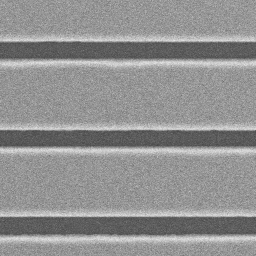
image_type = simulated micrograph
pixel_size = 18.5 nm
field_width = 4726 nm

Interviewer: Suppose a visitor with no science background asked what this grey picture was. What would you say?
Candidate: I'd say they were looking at lines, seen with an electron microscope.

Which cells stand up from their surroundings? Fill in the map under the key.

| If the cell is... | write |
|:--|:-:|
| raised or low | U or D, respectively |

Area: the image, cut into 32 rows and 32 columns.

UUUUUUUUUUUUUUUUUUUUUUUUUUUUUUUU
UUUUUUUUUUUUUUUUUUUUUUUUUUUUUUUU
UUUUUUUUUUUUUUUUUUUUUUUUUUUUUUUU
UUUUUUUUUUUUUUUUUUUUUUUUUUUUUUUU
UUUUUUUUUUUUUUUUUUUUUUUUUUUUUUUU
DDDDDDDDDDDDDDDDDDDDDDDDDDDDDDDD
DDDDDDDDDDDDDDDDDDDDDDDDDDDDDDDD
DDDDDDDDDDDDDDDDDDDDDDDDDDDDDDDD
UUUUUUUUUUUUUUUUUUUUUUUUUUUUUUUU
UUUUUUUUUUUUUUUUUUUUUUUUUUUUUUUU
UUUUUUUUUUUUUUUUUUUUUUUUUUUUUUUU
UUUUUUUUUUUUUUUUUUUUUUUUUUUUUUUU
UUUUUUUUUUUUUUUUUUUUUUUUUUUUUUUU
UUUUUUUUUUUUUUUUUUUUUUUUUUUUUUUU
UUUUUUUUUUUUUUUUUUUUUUUUUUUUUUUU
UUUUUUUUUUUUUUUUUUUUUUUUUUUUUUUU
DDDDDDDDDDDDDDDDDDDDDDDDDDDDDDDD
DDDDDDDDDDDDDDDDDDDDDDDDDDDDDDDD
UUUUUUUUUUUUUUUUUUUUUUUUUUUUUUUU
UUUUUUUUUUUUUUUUUUUUUUUUUUUUUUUU
UUUUUUUUUUUUUUUUUUUUUUUUUUUUUUUU
UUUUUUUUUUUUUUUUUUUUUUUUUUUUUUUU
UUUUUUUUUUUUUUUUUUUUUUUUUUUUUUUU
UUUUUUUUUUUUUUUUUUUUUUUUUUUUUUUU
UUUUUUUUUUUUUUUUUUUUUUUUUUUUUUUU
UUUUUUUUUUUUUUUUUUUUUUUUUUUUUUUU
UUUUUUUUUUUUUUUUUUUUUUUUUUUUUUUU
DDDDDDDDDDDDDDDDDDDDDDDDDDDDDDDD
DDDDDDDDDDDDDDDDDDDDDDDDDDDDDDDD
DDDDDDDDDDDDUUDDDDDDDDDDDUDDUDUU
UUUUUUUUUUUUUUUUUUUUUUUUUUUUUUUU
UUUUUUUUUUUUUUUUUUUUUUUUUUUUUUUU